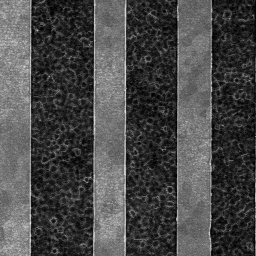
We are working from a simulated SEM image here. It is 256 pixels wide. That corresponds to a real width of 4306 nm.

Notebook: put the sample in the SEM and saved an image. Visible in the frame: one or a few lines or trenches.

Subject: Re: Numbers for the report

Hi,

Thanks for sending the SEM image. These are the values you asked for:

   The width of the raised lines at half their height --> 540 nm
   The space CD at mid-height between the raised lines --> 877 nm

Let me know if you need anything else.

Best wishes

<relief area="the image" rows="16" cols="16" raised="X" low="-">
XX----XX---XX---
XX----XX---XX---
XX----XX---XX---
XX----XX---XX---
XX----XX---XX---
XX----XX---XX---
XX----XX---XX---
XX----XX---XX---
XX----XX---XX---
XX----XX---XX---
XX----XX---XX---
XX----XX---XX---
XX----XX---XX---
XX----XX---XX---
XX----XX---XX---
XX----XX---XX---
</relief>